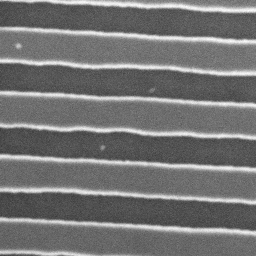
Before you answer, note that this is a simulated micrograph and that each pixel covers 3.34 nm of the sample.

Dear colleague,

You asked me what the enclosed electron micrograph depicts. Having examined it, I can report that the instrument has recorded lines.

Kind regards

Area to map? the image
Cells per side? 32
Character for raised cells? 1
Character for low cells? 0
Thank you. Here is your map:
00000000000111111111111111111111
00000000000000000000000000000000
00000000000000000000000000000000
00000000000000000000000000000000
11111111111111111100000000000000
11111111111111111111111111111111
11111111111111111111111111111111
11111111111111111111111111111111
00000000000000000111111111111111
00000000000000000000000000000000
00000000000000000000000000000000
00000000000000000000000000000000
11111111111111111111100000000000
11111111111111111111111111111111
11111111111111111111111111111111
11111111111111111111111111111111
00000000000000001111111111111111
00000000000000000000000000000000
00000000000000000000000000000000
00000000000000000000000000000000
11111111111111111111000000000000
11111111111111111111111111111111
11111111111111111111111111111111
11111111111111111111111111111111
00000000000000000111111111111111
00000000000000000000000000000000
00000000000000000000000000000000
11110000000000000000000000000000
11111111111111111111110000000000
11111111111111111111111111111111
11111111111111111111111111111111
11111111111111111111111111111111